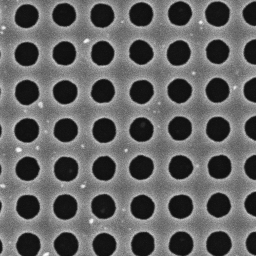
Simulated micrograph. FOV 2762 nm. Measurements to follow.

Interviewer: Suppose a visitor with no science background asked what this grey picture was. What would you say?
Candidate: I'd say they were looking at a regular array of holes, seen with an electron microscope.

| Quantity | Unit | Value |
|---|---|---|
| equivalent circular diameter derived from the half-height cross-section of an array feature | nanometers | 268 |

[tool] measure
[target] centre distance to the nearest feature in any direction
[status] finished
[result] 408 nm